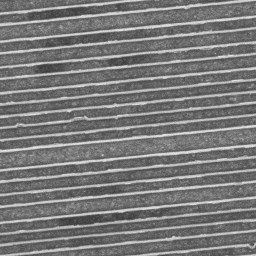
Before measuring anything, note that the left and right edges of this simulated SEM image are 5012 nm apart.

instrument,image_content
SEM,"parallel lines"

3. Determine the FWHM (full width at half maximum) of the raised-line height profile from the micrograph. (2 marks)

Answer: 239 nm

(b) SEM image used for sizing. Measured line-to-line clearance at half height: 0.256 um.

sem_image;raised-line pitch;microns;0.497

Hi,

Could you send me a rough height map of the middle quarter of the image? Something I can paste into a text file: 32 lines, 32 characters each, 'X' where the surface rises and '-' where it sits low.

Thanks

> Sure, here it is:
XXXXXXXXXXXXXXXXXX--------------
XXXXXXXX------------------------
--------------------------------
-----------------------XXXXXXXXX
-------------XXXXXXXXXXXXXXXXXXX
--XXXXXXXXXXXXXXXXXXXXXXXXXXXXXX
XXXXXXXXXXXXXXXXXXXXX-----------
XXXXXXXXXXX---------------------
X-------------------------------
----------------------XXXXXXXXXX
-----------XXXXXXXXXXXXXXXXXXXXX
-XXXXXXXXXXXXXXXXXXXXXXXXXXXXX--
XXXXXXXXXXXXXXXXXXXX------------
XXXXXXXXXX----------------------
------------------------------XX
--------------------XXXXXXXXXXXX
----------XXXXXXXXXXXXXXXXXXXXXX
XXXXXXXXXXXXXXXXXXXXXXXXXXXXX---
XXXXXXXXXXXXXXXXX---------------
XXXXXXX-------------------------
--------------------------------
--------------------------------
--------------------------XXXXXX
----------------XXXXXXXXXXXXXXXX
------XXXXXXXXXXXXXXXXXXXXXXXXXX
XXXXXXXXXXXXXXXXXXXXXXXXX-------
XXXXXXXXXXXXXXX-----------------
XXXX----------------------------
---------------------------XXXXX
-----------------XXXXXXXXXXXXXXX
-------XXXXXXXXXXXXXXXXXXXXXXXXX
XXXXXXXXXXXXXXXXXXXXXXXXXX------